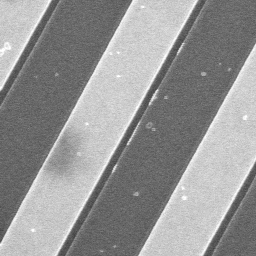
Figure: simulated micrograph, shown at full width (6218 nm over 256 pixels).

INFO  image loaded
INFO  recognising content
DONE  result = lines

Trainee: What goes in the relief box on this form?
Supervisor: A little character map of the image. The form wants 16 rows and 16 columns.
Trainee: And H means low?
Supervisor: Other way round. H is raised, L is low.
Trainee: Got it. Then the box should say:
HHHLLLLLHHHHLLLL
HHLLLLLHHHHHLLLL
HHLLLLLHHHHLLLLL
HLLLLLHHHHLLLLLL
HLLLLLHHHHLLLLLH
LLLLLHHHHLLLLLHH
LLLLLHHHHLLLLLHH
LLLLHHHHLLLLLHHH
LLLLHHHHLLLLLHHH
LLLHHHHLLLLLHHHH
LLLHHHHLLLLLHHHH
LLHHHHLLLLLHHHHL
LHHHHLLLLLLHHHHL
LHHHHLLLLLHHHHLL
HHHHLLLLLHHHHLLL
HHHHLLLLLHHHHLLL